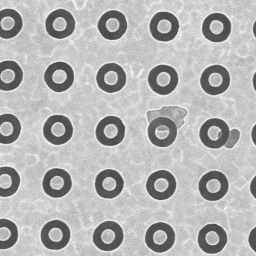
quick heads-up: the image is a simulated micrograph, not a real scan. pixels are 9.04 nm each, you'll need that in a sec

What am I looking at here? a regular array of ring-shaped grooves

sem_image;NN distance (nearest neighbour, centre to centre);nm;470